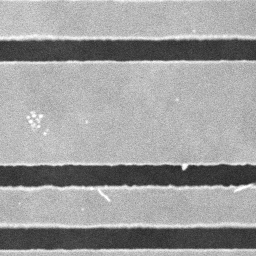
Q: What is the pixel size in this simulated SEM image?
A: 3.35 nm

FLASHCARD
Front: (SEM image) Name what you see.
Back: lines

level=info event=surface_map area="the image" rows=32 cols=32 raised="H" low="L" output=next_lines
HHHHHHHHHHHHHHHHHHHHHHHHHHHHHHHH
HHHHHHHHHHHHHHHHHHHHHHHHHHHHHHHH
HHHHHHHHHHHHHHHHHHHHHHHHHHHHHHHH
HHHHHHHHHHHHHHHHHHHHHHHHHHHHHHHH
HHHHHHHHHHHHHHHHHHHHHHHHHHHHHHHH
LLLLLLLLLLLLLLLLLLLLLLLLLLLLLLLL
LLLLLLLLLLLLLLLLLLLLLLLLLLLLLLLL
LLLLLLLLLLLLLLLLLLLLLLLLLLLLLLLL
HHHHHHHHHHHHHHHHHHHHHHHHHHHHHHHH
HHHHHHHHHHHHHHHHHHHHHHHHHHHHHHHH
HHHHHHHHHHHHHHHHHHHHHHHHHHHHHHHH
HHHHHHHHHHHHHHHHHHHHHHHHHHHHHHHH
HHHHHHHHHHHHHHHHHHHHHHHHHHHHHHHH
HHHHHHHHHHHHHHHHHHHHHHHHHHHHHHHH
HHHHHHHHHHHHHHHHHHHHHHHHHHHHHHHH
HHHHHHHHHHHHHHHHHHHHHHHHHHHHHHHH
HHHHHHHHHHHHHHHHHHHHHHHHHHHHHHHH
HHHHHHHHHHHHHHHHHHHHHHHHHHHHHHHH
HHHHHHHHHHHHHHHHHHHHHHHHHHHHHHHH
HHHHHHHHHHHHHHHHHHHHHHHHHHHHHHHH
HHHHHHHHHHHHHHHHHHHHHHHHHHHLHHHH
LLLLLLLLLLLLLLLLLLLLLLLLLLLLLLLL
LLLLLLLLLLLLLLLLLLLLLLLLLLLLLLLL
HHHHHHHHHHHHHHHHHHHHHHHHHHHHHHHH
HHHHHHHHHHHHHHHHHHHHHHHHHHHHHHHH
HHHHHHHHHHHHHHHHHHHHHHHHHHHHHHHH
HHHHHHHHHHHHHHHHHHHHHHHHHHHHHHHH
HHHHHHHHHHHHHHHHHHHHHHHHHHHHHHHH
LHHHHHLHHHHHLHHHHHHHHHHHLLLHLHLL
LLLLLLLLLLLLLLLLLLLLLLLLLLLLLLLL
LLLLLLLLLLLLLLLLLLLLLLLLLLLLLLLL
HHHHHHHHHHHHHHHHHHHHHHHHHHHHHHHH